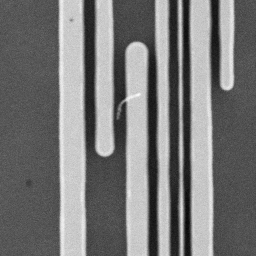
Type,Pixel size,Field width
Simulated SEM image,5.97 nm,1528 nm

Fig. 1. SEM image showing groups of lines, slits or small figures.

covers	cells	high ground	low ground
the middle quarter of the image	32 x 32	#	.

#####...####....#####..###......
#####...####....#####..###......
#####...####....#####..###......
#####...####....#####..###......
#####...####....#####..###......
#####...####....#####..###......
#####...####....#####..###......
#####...####....#####..###......
#####...####....#####..###......
#####...####....#####...##......
#####...####....#####...##......
#####...####....#####...##......
#####...####....#####...##......
#####...####....#####...##......
#####...####....#####...##......
#####...####....#####...##......
#####...####....#####..###......
#####...####....#####..###......
#####...####....#####..###......
#####...####....#####..###......
#####...####....#####..###......
#####...####....#####..###......
#####....##.....#####...##......
#####...........#####...##......
#####...........#####...##......
#####...........#####...##......
#####...........#####...##......
#####...........#####...##......
#####...........#####...##......
#####...........#####...##......
#####...........#####...##......
#####...........#####...##...#..